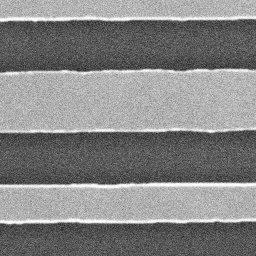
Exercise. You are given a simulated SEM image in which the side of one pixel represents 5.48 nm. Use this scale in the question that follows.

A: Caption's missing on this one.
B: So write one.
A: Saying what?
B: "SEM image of lines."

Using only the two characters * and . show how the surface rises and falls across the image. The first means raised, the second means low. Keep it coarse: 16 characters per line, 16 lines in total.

****************
................
................
................
.***************
****************
****************
****************
................
................
................
................
****************
****************
................
................